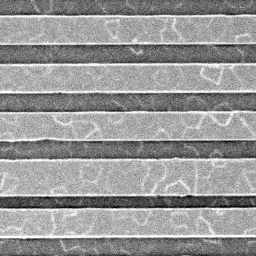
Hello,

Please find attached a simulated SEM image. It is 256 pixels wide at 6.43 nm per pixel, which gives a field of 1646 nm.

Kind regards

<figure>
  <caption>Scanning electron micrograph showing parallel lines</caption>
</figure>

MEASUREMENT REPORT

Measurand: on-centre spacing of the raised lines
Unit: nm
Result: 310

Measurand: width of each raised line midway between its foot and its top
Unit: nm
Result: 182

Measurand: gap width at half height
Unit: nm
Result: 125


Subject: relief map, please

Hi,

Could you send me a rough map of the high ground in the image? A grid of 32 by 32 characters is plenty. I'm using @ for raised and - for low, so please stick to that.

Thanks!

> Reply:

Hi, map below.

--------------------------------
--------------------------------
@@@@@@@@@@@@@@@@@@@@@@@@@@@@@@@@
@@@@@@@@@@@@@@@@@@@@@@@@@@@@@@@@
@@@@@@@@@@@@@@@@@@@@@@@@@@@@@@@@
--------------------------------
--------------------------------
--------------------------------
@@@@@@@@@@@@@@@@@@@@@@@@@@@@@@@@
@@@@@@@@@@@@@@@@@@@@@@@@@@@@@@@@
@@@@@@@@@@@@@@@@@@@@@@@@@@@@@@@@
@@@@@@@@@@@---------------------
--------------------------------
--------------------------------
@@@@@@@@@@@@@@@@@@@@@@@@@@@@@@@@
@@@@@@@@@@@@@@@@@@@@@@@@@@@@@@@@
@@@@@@@@@@@@@@@@@@@@@@@@@@@@@@@@
@@@-------@@----@@@@@-@@-@@@@@@-
--------------------------------
--------------------------------
@@@@@@@@@@@@@@@@@@@@@@@@@@@@@@@@
@@@@@@@@@@@@@@@@@@@@@@@@@@@@@@@@
@@@@@@@@@@@@@@@@@@@@@@@@@@@@@@@@
@@@@@@@@@@@@@@@@@@@@@@@@@@@@@@@@
--------------------------------
--------------------------------
@@@@@@@@@@@@@@@@@@@@@@@@@@@@@@@@
@@@@@@@@@@@@@@@@@@@@@@@@@@@@@@@@
@@@@@@@@@@@@@@@@@@@@@@@@@@@@@@@@
@@@@@@@@@@@@@@@@@@@@@@@@@@@@@@@@
--------------------------------
--------------------------------